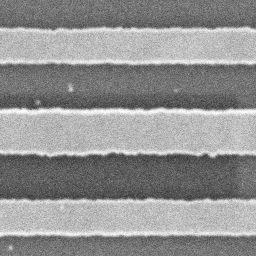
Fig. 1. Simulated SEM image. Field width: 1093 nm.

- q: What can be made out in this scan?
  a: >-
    lines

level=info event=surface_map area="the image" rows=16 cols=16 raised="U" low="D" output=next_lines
DDDDDDDDDDDDDDDD
DDDDDDDDDDDDDDDD
UUUUUUUUUUUUUUUU
UUUUUUUUUUUUUUUU
DDDDDDDDDDDDDDDD
DDDDDDDDDDDDDDDD
DDDDDDDDDDDDDDDD
UUUUUUUUUUUUUUUU
UUUUUUUUUUUUUUUU
UUUUUUUUUUUUUUUU
DDDDDDDDDDDDDDDD
DDDDDDDDDDDDDDDD
DDDDDDDDDUDDDDDD
UUUUUUUUUUUUUUUU
UUUUUUUUUUUUUUUU
DDDDDDDDDDDDDDDD